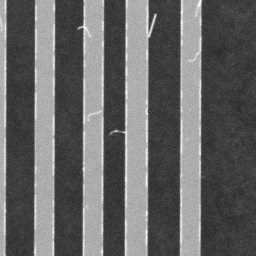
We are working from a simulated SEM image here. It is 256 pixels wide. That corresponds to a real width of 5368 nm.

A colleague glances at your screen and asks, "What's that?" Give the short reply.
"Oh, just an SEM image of parallel lines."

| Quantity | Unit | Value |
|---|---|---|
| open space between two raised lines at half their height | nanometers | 613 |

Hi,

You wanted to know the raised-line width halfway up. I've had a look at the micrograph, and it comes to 0.414 um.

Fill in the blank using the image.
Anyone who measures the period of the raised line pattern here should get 1020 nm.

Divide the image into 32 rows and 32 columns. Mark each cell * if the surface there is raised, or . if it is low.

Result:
*...***....**...**.....**.......
*...***....**...**.....**.......
*...***....**...**.....**.......
*...***...***...***....**.......
*...***....**...***....**.......
*...***....**...**.....**.......
*...***....**...**.....**.......
*...***....**...**.....**.......
*...***....**...**.....**.......
*...***....**...**.....**.......
*...***....**...**.....**.......
*...***....**...**.....**.......
*...***....**...**.....**.......
*...***....**...**.....**.......
*...***....**...**.....**.......
*...***...***...**.....**.......
*...***...***...**.....**.......
*...***...***...**.....**.......
*...***...***...**.....**.......
*...***...***...**.....**.......
*...***...***...**.....**.......
*...***...***...**.....**.......
*...***...***...**.....**.......
*...***...***...**.....**.......
*...***...***...**.....**.......
*...***...***...**.....**.......
*...***...***...**.....**.......
*...***...***...**.....**.......
*...***...***...**.....**.......
*...***...***...**.....**.......
*...***...***...**.....**.......
*...***...***...**.....**.......